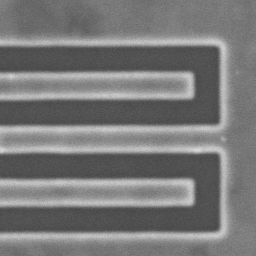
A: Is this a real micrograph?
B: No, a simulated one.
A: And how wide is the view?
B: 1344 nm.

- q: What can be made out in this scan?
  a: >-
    groups of lines, slits or small figures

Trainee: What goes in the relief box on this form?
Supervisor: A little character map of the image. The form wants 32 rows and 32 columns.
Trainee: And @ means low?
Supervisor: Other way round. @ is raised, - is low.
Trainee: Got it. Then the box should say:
@@@@@@@@@@@@@@@@@@@@@@@@@@@@@@@@
@@@@@@@@@@@@@@@@@@@@@@@@@@@@@@@@
@@@@@@@@@@@@@@@@@@@@@@@@@@@@@@@@
@@@@@@@@@@@@@@@@@@@@@@@@@@@@@@@@
@@@@@@@@@@@@@@@@@@@@@@@@@@@@@@@@
@@@@@@---@@@@@@------------@@@@@
----------------------------@@@@
----------------------------@@@@
----------------------------@@@@
@@@@@@@@@@@@@@@@@@@@@@@@----@@@@
@@@@@@@@@@@@@@@@@@@@@@@@----@@@@
@@@@@@@@@@@@@@@@@@@@@@@@----@@@@
----------------------------@@@@
----------------------------@@@@
----------------------------@@@@
---------------------------@@@@@
@@@@@@@@@@@@@@@@@@@@@@@@@@@@@@@@
@@@@@@@@@@@@@@@@@@@@@@@@@@@@@@@@
@@@@@@@@@@@@@@@@@@@@@@@@@@@@@@@@
----------------------------@@@@
----------------------------@@@@
----------------------------@@@@
----------------------------@@@@
@@@@@@@@@@@@@@@@@@@@@@@@----@@@@
@@@@@@@@@@@@@@@@@@@@@@@@----@@@@
@@@@@@@@@@@@@@@@@@@@@@@@----@@@@
----------------------------@@@@
----------------------------@@@@
----------------------------@@@@
@@@@@@@@@@@@@@@@@@@@@@@@@@@@@@@@
@@@@@@@@@@@@@@@@@@@@@@@@@@@@@@@@
@@@@@@@@@@@@@@@@@@@@@@@@@@@@@@@@